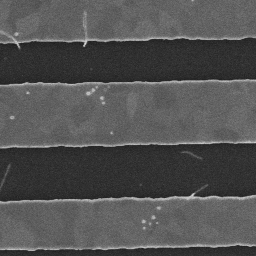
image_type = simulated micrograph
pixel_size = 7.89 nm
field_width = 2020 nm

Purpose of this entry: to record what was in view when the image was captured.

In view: lines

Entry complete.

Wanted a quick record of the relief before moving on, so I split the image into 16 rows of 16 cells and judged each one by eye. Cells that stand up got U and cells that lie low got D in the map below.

UUUUUUUUUUUUUUUU
UUUUUUUUUUUUUUUU
UUUUUUUUUDDDDDDD
DDDDDDDDDDDDDDDD
DDDDDDDDDDDDDDDD
UUUUUUUUUUUUUUUU
UUUUUUUUUUUUUUUU
UUUUUUUUUUUUUUUU
UUUUUUUUUUUUUUUU
DDDDDDDDDDDDDDDD
DDDDDDDDDDDDDDDD
DDDDDDDDDDDDDDDD
DDDUUUUUUUUUUUUU
UUUUUUUUUUUUUUUU
UUUUUUUUUUUUUUUU
UUUUUUUUDDDDDDDD